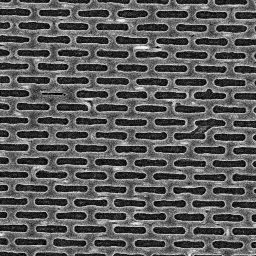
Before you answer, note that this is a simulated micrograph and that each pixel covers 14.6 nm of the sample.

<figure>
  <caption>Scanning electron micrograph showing a regular array of holes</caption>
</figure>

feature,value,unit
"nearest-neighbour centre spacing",338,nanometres